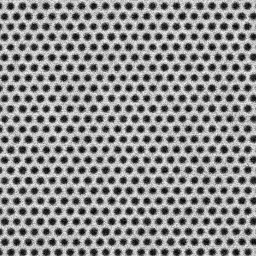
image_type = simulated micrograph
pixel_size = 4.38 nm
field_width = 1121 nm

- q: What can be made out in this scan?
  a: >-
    a regular array of holes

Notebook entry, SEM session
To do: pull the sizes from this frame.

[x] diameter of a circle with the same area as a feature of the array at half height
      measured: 34.2 nanometres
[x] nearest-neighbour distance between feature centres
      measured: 50 nm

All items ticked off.